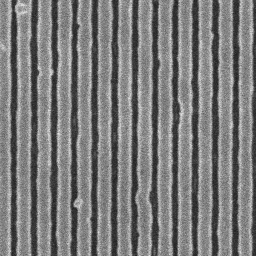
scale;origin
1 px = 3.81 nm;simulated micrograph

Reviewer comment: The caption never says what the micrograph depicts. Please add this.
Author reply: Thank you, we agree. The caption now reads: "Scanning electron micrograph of parallel lines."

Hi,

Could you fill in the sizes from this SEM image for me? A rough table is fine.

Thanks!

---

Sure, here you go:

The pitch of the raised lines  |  0.0768 µm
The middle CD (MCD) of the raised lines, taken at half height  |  0.0481 um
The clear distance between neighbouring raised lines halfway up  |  29.5 nanometers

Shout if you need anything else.